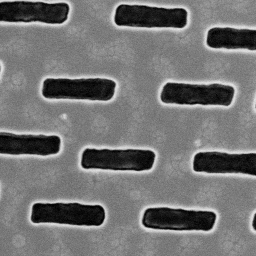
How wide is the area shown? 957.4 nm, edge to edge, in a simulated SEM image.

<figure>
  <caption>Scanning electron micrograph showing holes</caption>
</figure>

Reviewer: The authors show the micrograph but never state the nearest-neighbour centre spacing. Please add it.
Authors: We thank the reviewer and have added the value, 310 nanometres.